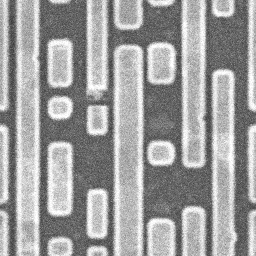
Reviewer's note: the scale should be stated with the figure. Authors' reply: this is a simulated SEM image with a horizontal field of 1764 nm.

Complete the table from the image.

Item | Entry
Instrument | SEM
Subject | parallel lines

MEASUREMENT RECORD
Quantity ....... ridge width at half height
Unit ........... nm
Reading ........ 118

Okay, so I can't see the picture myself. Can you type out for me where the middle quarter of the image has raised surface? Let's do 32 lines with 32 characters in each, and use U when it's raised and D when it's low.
UDDDDDDUUUDDDUUUUUUDDDUUUUUDDDUU
UDDDDDDUUUDDDUUUUUUDDDUUUUUDDDUU
UDDDDDDUUUDDDUUUUUUDDDUUUUUDDDUU
UDDDDDDUUUDDDUUUUUUDDDUUUUUDDDUU
UDDDDDDUUUDDDUUUUUUDDDDDDDDDDDUU
DDDDDDDUUUDDDUUUUUUDDDDDDDDDDDUU
DDDDDDDDDDDDDUUUUUUDDDDDDDDDDDUU
DDDDDDDDDDDDDUUUUUUDDDDDDDDDDDUU
DDDDDDDDDDDDDUUUUUUDDDDDDDDDDDUU
UDDDDDDDDDDDDUUUUUUDDDDDDDDDDDUU
UDDDDDDDDDDDDUUUUUUDDDDDDDDDDDUU
UDDDDDDUUUDDDUUUUUUDDDDDDDDDDDUU
UDDDDDDUUUDDDUUUUUUDDDDDDDDDDDUU
DDDDDDDUUUDDDUUUUUUDDDDDDDDDDDUU
DDDDDDDUUUDDDUUUUUUDDDDDDDDDDDUU
DDDDDDDUUUDDDUUUUUUDDDDDDDDDDDUU
DDDDDDDUUUDDDUUUUUUDDDDDDDDDDDUU
DDDDDDDDDDDDDUUUUUUDDDDDDDDDDDUU
DDDDDDDDDDDDDUUUUUUDDDDDDDDDDDUU
DDDDDDDDDDDDDUUUUUUDDDDDDDDDDDUU
UDDDDDDDDDDDDUUUUUUDDDUUUUDDDDUU
UDDDDDDDDDDDDUUUUUUDDDUUUUUDDDUU
UDDDDDDDDDDDDUUUUUUDDDUUUUUDDDUU
UDDDDDDDDDDDDUUUUUUDDDUUUUUDDDUU
UDDDDDDDDDDDDUUUUUUDDDDDDDDDDDUU
UDDDDDDDDDDDDUUUUUUDDDDDDDDDDDDD
UDDDDDDDDDDDDUUUUUUDDDDDDDDDDDDD
UDDDDDDDDDDDDUUUUUUDDDDDDDDDDDDD
UDDDDDDDDDDDDUUUUUUDDDDDDDDDDDDD
UDDDDDDDDDDDDUUUUUUDDDDDDDDDDDDD
UDDDDDDDDDDDDUUUUUUDDDDDDDDDDDDD
UDDDDDDDDDDDDUUUUUUDDDDDDDDDDDDD